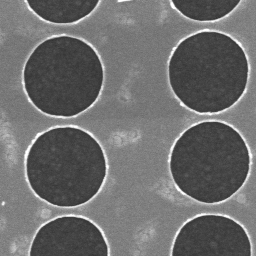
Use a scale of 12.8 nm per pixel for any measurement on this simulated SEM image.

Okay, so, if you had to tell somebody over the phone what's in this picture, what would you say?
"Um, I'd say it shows holes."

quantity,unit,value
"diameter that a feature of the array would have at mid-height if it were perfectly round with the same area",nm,1020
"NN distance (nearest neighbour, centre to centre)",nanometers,1160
